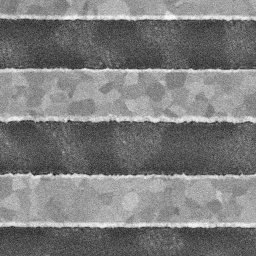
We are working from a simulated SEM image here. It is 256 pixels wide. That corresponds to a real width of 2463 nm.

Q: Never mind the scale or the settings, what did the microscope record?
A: lines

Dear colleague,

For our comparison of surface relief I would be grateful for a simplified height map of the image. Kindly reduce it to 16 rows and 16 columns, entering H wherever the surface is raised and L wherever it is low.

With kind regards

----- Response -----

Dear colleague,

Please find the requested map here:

HHHHHHHHHHHHHHHH
LLLLLLLLLLLLLLLL
LLLLLLLLLLLLLLLL
LLLLLLLLLLLLLLLL
HHHHHHHHHHHHHHHH
HHHHHHHHHHHHHHHH
HHHHHHHHHHHHHHHH
HLHHHHHHHHHHHHHH
LLLLLLLLLLLLLLLL
LLLLLLLLLLLLLLLL
LLLLLLLLLLLLLLLL
HHHHHHHHHHHHHHHH
HHHHHHHHHHHHHHHH
HHHHHHHHHHHHHHHH
LLLLLLLLLLLLLLLL
LLLLLLLLLLLLLLLL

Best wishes